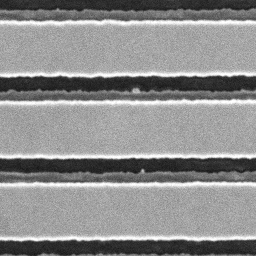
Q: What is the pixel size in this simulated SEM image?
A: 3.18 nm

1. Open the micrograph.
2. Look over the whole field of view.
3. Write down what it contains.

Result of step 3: lines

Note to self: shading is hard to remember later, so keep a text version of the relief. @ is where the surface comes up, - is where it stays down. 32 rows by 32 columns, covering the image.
--------------------------------
--------------------------------
-------------@------------------
@@@@@@@@@@@@@@@@@@@@@@@@@@@@@@@@
@@@@@@@@@@@@@@@@@@@@@@@@@@@@@@@@
@@@@@@@@@@@@@@@@@@@@@@@@@@@@@@@@
@@@@@@@@@@@@@@@@@@@@@@@@@@@@@@@@
@@@@@@@@@@@@@@@@@@@@@@@@@@@@@@@@
@@@@@@@@@@@@@@@@@@@@@@@@@@@@@@@@
@@@@@@@-@@@@@@@@@@@-@@-@@@--@--@
--------------------------------
--------------------------------
-------------------------@---@-@
@@@@@@@@@@@@@@@@@@@@@@@@@@@@@@@@
@@@@@@@@@@@@@@@@@@@@@@@@@@@@@@@@
@@@@@@@@@@@@@@@@@@@@@@@@@@@@@@@@
@@@@@@@@@@@@@@@@@@@@@@@@@@@@@@@@
@@@@@@@@@@@@@@@@@@@@@@@@@@@@@@@@
@@@@@@@@@@@@@@@@@@@@@@@@@@@@@@@@
@@@@@@@@@@@@@@@@@@@@@@@@@@@@@@@@
--------------------------------
--------------------------------
--------------------------------
@@@@@@@@@@@@@@@@@@@@@@@@@@@@@@@@
@@@@@@@@@@@@@@@@@@@@@@@@@@@@@@@@
@@@@@@@@@@@@@@@@@@@@@@@@@@@@@@@@
@@@@@@@@@@@@@@@@@@@@@@@@@@@@@@@@
@@@@@@@@@@@@@@@@@@@@@@@@@@@@@@@@
@@@@@@@@@@@@@@@@@@@@@@@@@@@@@@@@
@@@@@@@@@@@@@@@@@@@@@@@@@@@@@@@@
--------------------------------
--------------------------------